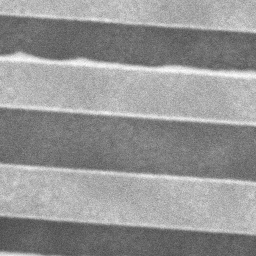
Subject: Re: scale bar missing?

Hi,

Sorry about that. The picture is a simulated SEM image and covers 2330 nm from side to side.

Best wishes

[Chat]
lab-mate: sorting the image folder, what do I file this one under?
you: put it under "lines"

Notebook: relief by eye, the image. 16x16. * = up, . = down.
****************
........********
................
................
**************..
****************
****************
............****
................
................
***.............
****************
****************
****************
..............**
................